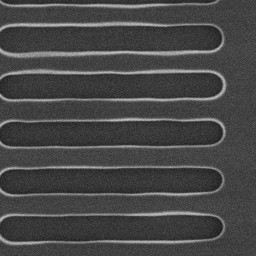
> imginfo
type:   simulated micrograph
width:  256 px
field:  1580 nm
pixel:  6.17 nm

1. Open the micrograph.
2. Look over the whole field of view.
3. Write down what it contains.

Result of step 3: groups of lines, slits or small figures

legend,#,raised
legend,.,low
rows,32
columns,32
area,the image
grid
#.....................##########
################################
################################
...........................#####
............................####
............................####
#..............#.......#########
################################
################################
#..........................#####
............................####
............................####
#..#..##########################
################################
################################
...........................#####
............................####
............................####
################################
################################
################################
...........................#####
............................####
...........................#####
################################
################################
################################
............................####
............................####
...........................#####
################################
################################